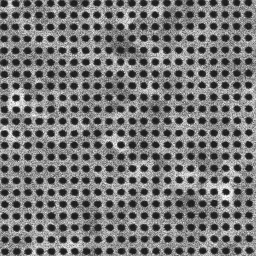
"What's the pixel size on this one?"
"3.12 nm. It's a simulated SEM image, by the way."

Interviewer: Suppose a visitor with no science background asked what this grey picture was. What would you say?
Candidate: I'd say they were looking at a regular array of holes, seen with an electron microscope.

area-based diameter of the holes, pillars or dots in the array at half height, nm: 22.2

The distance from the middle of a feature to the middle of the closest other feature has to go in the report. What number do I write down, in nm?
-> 35.3